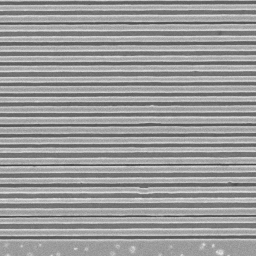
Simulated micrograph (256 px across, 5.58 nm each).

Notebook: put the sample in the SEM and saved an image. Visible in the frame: parallel lines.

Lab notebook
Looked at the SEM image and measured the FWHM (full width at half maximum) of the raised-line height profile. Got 32.8 nanometres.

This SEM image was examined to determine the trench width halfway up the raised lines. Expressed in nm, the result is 21.6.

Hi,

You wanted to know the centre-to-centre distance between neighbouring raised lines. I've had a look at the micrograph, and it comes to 57 nm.